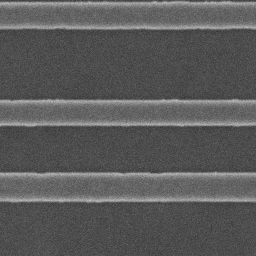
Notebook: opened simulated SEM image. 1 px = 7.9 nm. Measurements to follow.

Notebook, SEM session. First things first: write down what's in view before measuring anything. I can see lines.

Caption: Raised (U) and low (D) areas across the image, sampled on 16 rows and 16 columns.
UUUUUUUUUUUUUUUU
UUUUUUUUUUUUUUUU
DDDDDDDDDDDDDDDD
DDDDDDDDDDDDDDDD
DDDDDDDDDDDDDDDD
DDDDDDDDDDDDDDDD
UUUUUUUUUUUUUUUU
UUUUUUUUUUUUUUUU
DDDDDDDDDDDDDDDD
DDDDDDDDDDDDDDDD
DDDDDDDDDDDDDDDD
UUUUUUUUUUUUUUUU
UUUUUUUUUUUUUUUU
DDDDDDDDDDDDDDDD
DDDDDDDDDDDDDDDD
DDDDDDDDDDDDDDDD